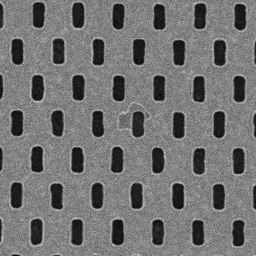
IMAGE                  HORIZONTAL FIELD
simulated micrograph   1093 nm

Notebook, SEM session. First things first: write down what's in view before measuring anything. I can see a regular array of holes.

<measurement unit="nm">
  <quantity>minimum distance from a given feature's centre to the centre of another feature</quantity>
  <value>172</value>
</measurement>